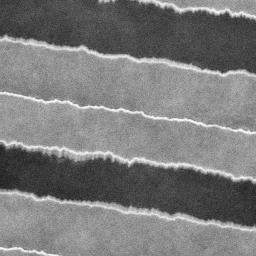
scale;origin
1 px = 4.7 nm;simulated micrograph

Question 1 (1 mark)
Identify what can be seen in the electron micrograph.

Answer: lines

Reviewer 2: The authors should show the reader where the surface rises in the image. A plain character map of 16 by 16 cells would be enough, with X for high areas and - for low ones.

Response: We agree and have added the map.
-----------XXXXX
----------------
X---------------
XXXXXXX---------
XXXXXXXXXXXXX---
XXXXXXXXXXXXXXXX
XXXXXXXXXXXXXXXX
XXXXXXXXXXXXXXXX
XXXXXXXXXXXXXXXX
----XXXXXXXXXXXX
------------XXXX
----------------
XXXX------------
XXXXXXXXXX------
XXXXXXXXXXXXXXXX
XXXXXXXXXXXXXXXX